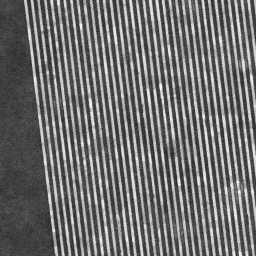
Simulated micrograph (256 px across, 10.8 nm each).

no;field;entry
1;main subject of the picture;parallel lines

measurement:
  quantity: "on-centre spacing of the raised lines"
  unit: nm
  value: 70.3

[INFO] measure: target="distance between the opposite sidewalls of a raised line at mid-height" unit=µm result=0.0215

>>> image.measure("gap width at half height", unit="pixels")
4.59